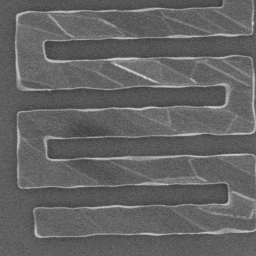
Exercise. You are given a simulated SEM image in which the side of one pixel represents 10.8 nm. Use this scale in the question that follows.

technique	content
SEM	groups of lines, slits or small figures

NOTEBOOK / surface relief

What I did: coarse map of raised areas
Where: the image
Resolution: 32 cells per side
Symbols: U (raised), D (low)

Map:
DDDDDDDDDDDDDDDDDDDDDDDDDDDDUUUU
DDDDUDDDDUUUUUUUUUUUUUUUUUUUUUUU
DDUUUUUUUUUUUUUUUUUUUUUUUUUUUUUU
DDUUUUUUUUUUUUUUUUUUUUUUUUUUUUUU
DDUUUUUUUUUUUUUUUUUUUUUUUUDDDDDD
DDUUUDDDDDDDDDDDDDDDDDDDDDDDDDDD
DDUUUUDDDDDDDDDDDDDDDDDDDDDDDDDD
DDUUUUDDDDDDUUUUUUUUUUUUUUUUUUUD
DDUUUUUUUUUUUUUUUUUUUUUUUUUUUUUU
DDUUUUUUUUUUUUUUUUUUUUUUUUUUUUUU
DDUUUUUUUUUUUUUUUUUUUUUUUUUUUUUU
DDDDDDDDDDDDDDDDDDDDDDDDDDDDUUUU
DDDDDDDDDDDDDDDDDDDDDDDDDDDDUUUU
DDDDDDDDDDDDDDDDDDDDDUUUUUUUUUUU
DDUUUUUUUUUUUUUUUUUUUUUUUUUUUUUU
DDUUUUUUUUUUUUUUUUUUUUUUUUUUUUUU
DDUUUUUUUUUUUUUUUUUUUUUUUUUUUUUU
DDUUUUDDDDDDDDDDDDDDDDDDDDDDDDDD
DDUUUUDDDDDDDDDDDDDDDDDDDDDDDDDD
DDUUUUDDDDDDDDDDDDDDDDDDDDDUUUUU
DDUUUUUUUUUUUUUUUUUUUUUUUUUUUUUU
DDUUUUUUUUUUUUUUUUUUUUUUUUUUUUUU
DDUUUUUUUUUUUUUUUUUUUUUUUUUUUUUU
DDDDDDDDDDDDDDDDDDDDDDDDDDDDUUUU
DDDDDDDDDDDDDDDDDDDDDDDDDDDDDUUU
DDDDDDDDDDDDDDDDDDDDDDDDDDDDUUUU
DDDDUUUUUUUUUUUUUUUUUUUUUUUUUUUU
DDDDUUUUUUUUUUUUUUUUUUUUUUUUUUUU
DDDDUUUUUUUUUUUUUUUUUUUUUUUUUUUU
DDDDDUDDDDDDDDDDDDDDDDDDDDDDDDDD
DDDDDDDDDDDDDDDDDDDDDDDDDDDDDDDD
DDDDDDDDDDDDDDDDDDDDDDDDDDDDDDDD